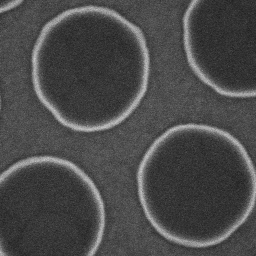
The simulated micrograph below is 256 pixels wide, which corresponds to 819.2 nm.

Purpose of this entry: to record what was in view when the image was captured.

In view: raised bodies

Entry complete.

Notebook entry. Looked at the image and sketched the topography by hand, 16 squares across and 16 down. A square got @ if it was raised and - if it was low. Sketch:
@----@------@@@@
---@@@@@----@@@@
--@@@@@@@---@@@@
--@@@@@@@---@@@@
--@@@@@@@---@@@@
--@@@@@@@----@@@
---@@@@@--------
----@@@@--------
----------@@@@--
---------@@@@@@-
-@@@@----@@@@@@@
@@@@@@---@@@@@@@
@@@@@@---@@@@@@@
@@@@@@---@@@@@@-
@@@@@@----@@@@--
@@@@@@----------